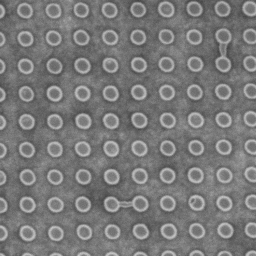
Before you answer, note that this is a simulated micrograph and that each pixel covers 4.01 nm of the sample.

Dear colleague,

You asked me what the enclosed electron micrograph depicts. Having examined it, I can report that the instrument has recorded a regular array of raised bodies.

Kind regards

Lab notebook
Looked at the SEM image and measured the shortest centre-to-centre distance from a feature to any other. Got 110 nanometers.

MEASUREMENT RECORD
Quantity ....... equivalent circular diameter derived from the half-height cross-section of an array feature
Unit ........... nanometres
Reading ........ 56.8